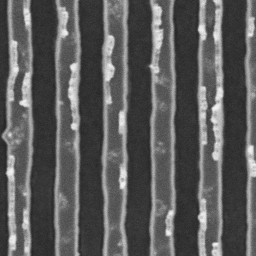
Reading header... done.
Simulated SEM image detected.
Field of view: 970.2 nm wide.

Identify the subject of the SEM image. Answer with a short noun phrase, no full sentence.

parallel lines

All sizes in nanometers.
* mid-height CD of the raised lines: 82.9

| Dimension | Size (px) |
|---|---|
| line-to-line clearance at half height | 26.3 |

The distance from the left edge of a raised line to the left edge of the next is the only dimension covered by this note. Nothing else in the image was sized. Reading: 0.181 um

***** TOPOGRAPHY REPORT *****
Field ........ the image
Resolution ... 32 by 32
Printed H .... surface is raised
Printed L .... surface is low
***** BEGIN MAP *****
LHHHLLLHHHLLLHHHLLLHHHLLLHHHLLLH
LHHHLLLHHHLLLHHHLLLHHLLLLHHHLLLH
LHHHLLLHHHLLLHHHLLLHHLLLLHHHLLLH
LHHHLLLLHHLLLHHHLLLHHHLLLHHHLLLH
LHHHLLLHHHLLLHHHLLLHHLLLLHHHLLLH
LHHHLLLHHHLLLHHHLLLHHHLLLHHHLLLH
LHHHLLLHHHLLLHHHLLLHHHLLLHHHLLLH
LHHHLLLHHHLLLHHHLLLHHHLLLHHHLLLH
LHHHLLLHHHLLLHHHLLLHHHLLLHHHLLLH
LHHHLLLHHHLLLHHHLLLHHHLLLHHHLLLH
LHHHLLLHHHLLLHHHLLLHHHLLLHHHLLLH
LHHHLLLHHHLLLHHHLLLHHHLLLHHHLLLH
LHHHLLLHHHLLLHHHLLLHHHLLLHHHLLLH
LHHHLLLHHHLLLHHHLLLHHHLLLHHHLLLH
LHHHLLLHHHLLLHHHLLLHHHLLLHHHLLLH
LHHHLLLHHHLLLHHHLLLHHHLLLHHHLLLH
LHHHLLLHHHLLLHHHLLLHHHLLLHHHLLLH
LHHHLLLHHHLLLHHHLLLHHHLLLHHHLLLH
LHHHLLLHHHLLLHHHLLLHHHLLLHHHLLLH
LHHHLLLHHHLLLHHHLLLHHHLLLHHHLLLH
LHHHLLLHHHLLLHHHLLLHHHLLLHHLLLLH
LHHHLLLHHHLLLHHHLLLHHHLLLHHHLLLH
LHHHLLLHHHLLLHHHLLLHHHLLLHHHLLLH
LHHHLLLHHHLLLHHHLLLHHHLLLHHHLLLH
LHHHLLLHHHLLLHHHLLLHHHLLLHHHLLLH
LHHHLLLHHHLLLHHHLLLHHHLLLHHHLLLH
LHHHLLLHHHLLLHHHLLLHHHLLLHHHLLLH
LHHHLLLHHHLLLHHLLLLHHHLLLHHHLLLH
LHHHLLLHHHLLLHHLLLLHHLLLLHHHLLLH
LHHHLLLHHHLLLHHHLLLHHLLLLHHHLLLH
LHHHLLLHHHLLLHHHLLLHHHLLLHHLLLLH
LHHHLLLHHHLLLHHHLLLHHHLLLHHHLLLH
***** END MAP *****